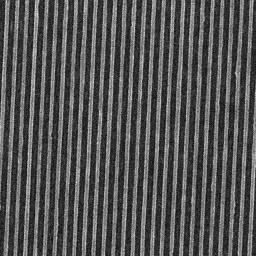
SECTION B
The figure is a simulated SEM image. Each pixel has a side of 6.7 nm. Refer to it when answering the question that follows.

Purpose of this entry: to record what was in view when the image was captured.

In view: parallel lines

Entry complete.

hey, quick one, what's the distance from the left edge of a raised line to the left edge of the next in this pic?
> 65.4 nanometres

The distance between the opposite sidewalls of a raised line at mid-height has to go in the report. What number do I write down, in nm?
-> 20.9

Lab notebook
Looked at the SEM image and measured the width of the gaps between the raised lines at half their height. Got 41.8 nm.